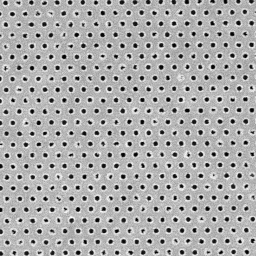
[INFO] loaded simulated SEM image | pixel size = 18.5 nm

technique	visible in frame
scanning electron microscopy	a regular array of holes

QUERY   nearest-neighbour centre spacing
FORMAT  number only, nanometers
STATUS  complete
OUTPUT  227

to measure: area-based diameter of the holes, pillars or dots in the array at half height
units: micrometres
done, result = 0.0909